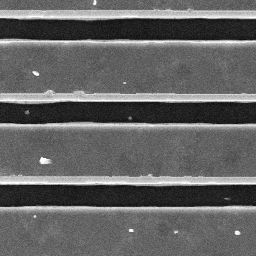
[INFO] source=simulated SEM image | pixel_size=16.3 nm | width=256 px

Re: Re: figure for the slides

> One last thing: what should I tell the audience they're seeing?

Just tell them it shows lines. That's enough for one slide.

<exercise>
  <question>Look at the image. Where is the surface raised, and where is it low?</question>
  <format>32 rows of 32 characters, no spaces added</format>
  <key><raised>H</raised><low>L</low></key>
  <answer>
HHHHHHHHHHHHHHHHHHHHHHHHHHHHHHHH
HHHHHHHHHHHHHHHHHHHHHHHHHHHHHHHH
LLLLLLLLLLLLLLLLLLLLLLLLLLLLLLLL
LLLLLLLLLLLLLLLLLLLLLLLLLLLLLLLL
LLLLLLLLLLLLLLLLLLLLLLLLLLLLLLLL
HHHHHHHHHHHHHHHHHHHHHHHHHHHHHHHH
HHHHHHHHHHHHHHHHHHHHHHHHHHHHHHHH
HHHHHHHHHHHHHHHHHHHHHHHHHHHHHHHH
HHHHHHHHHHHHHHHHHHHHHHHHHHHHHHHH
HHHHHHHHHHHHHHHHHHHHHHHHHHHHHHHH
HHHHHHHHHHHHHHHHHHHHHHHHHHHHHHHH
HHHHHHHHHHHHHHHHHHHHHHHHHHHHHHHH
HHHHHHHHLHHHHHHHHHHHHHHHHHHHHHHH
LLLLLLLLLLLLLLLLLLLLLLLLLLLLLLLL
LLLLLLLLLLLLLLLLLLLLLLLLLLLLLLLL
LLLLLLLLLLLLLLLLLLLLLLLLLLLLLLLL
HHHHHHHHHHHHHHHHHHHHHHHHHHHHHHHH
HHHHHHHHHHHHHHHHHHHHHHHHHHHHHHHH
HHHHHHHHHHHHHHHHHHHHHHHHHHHHHHHH
HHHHHHHHHHHHHHHHHHHHHHHHHHHHHHHH
HHHHHHHHHHHHHHHHHHHHHHHHHHHHHHHH
HHHHHHHHHHHHHHHHHHHHHHHHHHHHHHHH
HHHHHHHHHHHHHHHHHHHHHHHHHHHHHHHH
LLLLLLLLLLLLLLLLLLLLLLLLLLLLLLLL
LLLLLLLLLLLLLLLLLLLLLLLLLLLLLLLL
LLLLLLLLLLLLLLLLLLLLLLLLLLLLLLLL
HHHHHHHHHHHHHHHHHHHHHHHHHHHHHHHH
HHHHHHHHHHHHHHHHHHHHHHHHHHHHHHHH
HHHHHHHHHHHHHHHHHHHHHHHHHHHHHHHH
HHHHHHHHHHHHHHHHHHHHHHHHHHHHHHHH
HHHHHHHHHHHHHHHHHHHHHHHHHHHHHHHH
HHHHHHHHHHHHHHHHHHHHHHHHHHHHHHHH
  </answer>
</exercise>